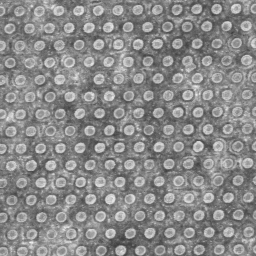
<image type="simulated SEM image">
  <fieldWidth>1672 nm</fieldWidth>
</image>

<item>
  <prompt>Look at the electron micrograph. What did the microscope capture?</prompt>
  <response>a regular array of raised bodies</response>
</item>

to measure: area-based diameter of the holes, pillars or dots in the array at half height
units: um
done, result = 0.0616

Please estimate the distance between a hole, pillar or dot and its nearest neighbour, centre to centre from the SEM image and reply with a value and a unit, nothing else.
19.2 pixels